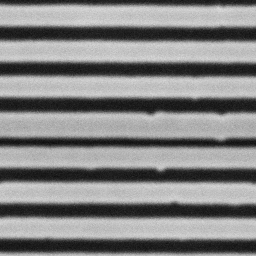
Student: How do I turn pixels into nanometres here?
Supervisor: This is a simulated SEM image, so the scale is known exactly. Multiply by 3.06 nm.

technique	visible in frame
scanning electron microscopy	parallel lines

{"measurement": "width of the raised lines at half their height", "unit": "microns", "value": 0.0632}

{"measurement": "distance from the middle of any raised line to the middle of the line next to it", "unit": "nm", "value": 108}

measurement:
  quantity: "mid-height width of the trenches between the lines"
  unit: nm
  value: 45.9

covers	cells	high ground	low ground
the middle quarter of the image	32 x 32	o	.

................................
................................
................................
oooooooooooooooooooooooooooooooo
oooooooooooooooooooooooooooooooo
oooooooooooooooooooooooooooooooo
oooooooooooooooooooooooooooooooo
oooooooooooooooooooooooooooooooo
................................
................................
................................
................................
oooooooooooooooooooo...ooooooooo
oooooooooooooooooooooooooooooooo
oooooooooooooooooooooooooooooooo
oooooooooooooooooooooooooooooooo
oooooooooooooooooooooooooooooooo
oooooooooooooooooooooooooooooooo
................................
................................
................................
oooooooooooooooooooooooooooooooo
oooooooooooooooooooooooooooooooo
oooooooooooooooooooooooooooooooo
oooooooooooooooooooooooooooooooo
oooooooooooooooooooooooooooooooo
................................
................................
................................
................................
oooooooooooooooooooooooooooooooo
oooooooooooooooooooooooooooooooo